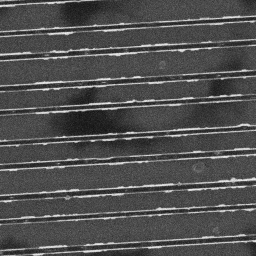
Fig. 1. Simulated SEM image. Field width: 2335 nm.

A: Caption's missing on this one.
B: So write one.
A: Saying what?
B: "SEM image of parallel lines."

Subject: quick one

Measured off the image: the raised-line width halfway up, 61.4 nm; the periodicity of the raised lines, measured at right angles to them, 249 nm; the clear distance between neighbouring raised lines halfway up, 202 nanometres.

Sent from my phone